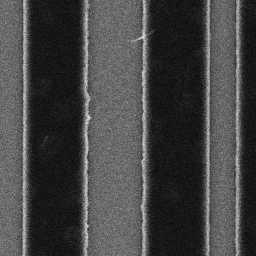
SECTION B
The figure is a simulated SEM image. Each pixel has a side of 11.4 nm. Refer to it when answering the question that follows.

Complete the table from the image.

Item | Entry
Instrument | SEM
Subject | one or a few lines or trenches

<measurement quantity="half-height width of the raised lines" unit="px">64.4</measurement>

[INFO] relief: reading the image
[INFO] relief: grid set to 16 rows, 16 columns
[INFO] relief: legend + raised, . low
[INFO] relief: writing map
..+++....++++..+
.++++....++++..+
.++++....++++..+
.++++....++++..+
.++++....++++..+
.++++....++++..+
.+++++...++++..+
.++++....++++..+
.++++....++++..+
.++++....++++..+
.++++....++++..+
.++++....++++..+
.++++....++++..+
.++++....++++..+
..+++....++++..+
..+++....++++..+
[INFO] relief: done